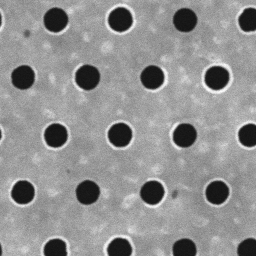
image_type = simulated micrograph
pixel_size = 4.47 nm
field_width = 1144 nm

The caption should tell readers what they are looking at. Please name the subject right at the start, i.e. a regular array of holes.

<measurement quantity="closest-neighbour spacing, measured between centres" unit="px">64.5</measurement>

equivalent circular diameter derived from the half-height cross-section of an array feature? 108 nm